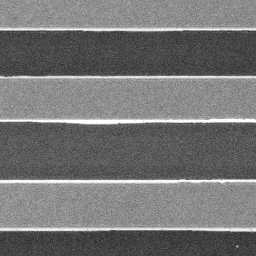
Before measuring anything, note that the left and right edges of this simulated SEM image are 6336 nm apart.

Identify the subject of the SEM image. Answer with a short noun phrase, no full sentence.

lines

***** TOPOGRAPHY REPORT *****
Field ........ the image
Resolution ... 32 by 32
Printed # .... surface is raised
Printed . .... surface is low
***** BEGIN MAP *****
################################
################################
################################
################################
................................
................................
................................
................................
................................
................................
################################
################################
################################
################################
################################
................................
................................
................................
................................
................................
................................
................................
................................
################################
################################
################################
################################
################################
################################
................................
................................
................................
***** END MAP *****